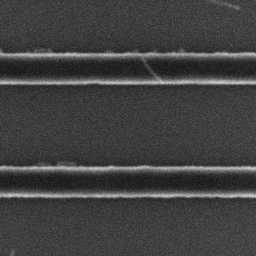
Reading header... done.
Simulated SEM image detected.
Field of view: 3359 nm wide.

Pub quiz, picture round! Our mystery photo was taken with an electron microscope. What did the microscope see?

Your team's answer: lines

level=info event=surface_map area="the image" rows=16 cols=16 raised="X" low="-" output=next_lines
----------------
----------------
----------------
XXXXXXXXXXXXXXXX
XXXXXXXXXXXXXXXX
----------------
----------------
----------------
----------------
----------------
XXXXXXXXXXXXXXXX
XXXXXXXXXXXXXXXX
----------------
----------------
----------------
----------------